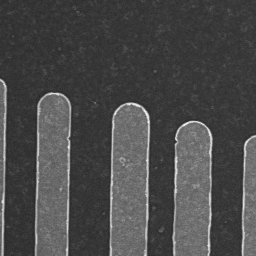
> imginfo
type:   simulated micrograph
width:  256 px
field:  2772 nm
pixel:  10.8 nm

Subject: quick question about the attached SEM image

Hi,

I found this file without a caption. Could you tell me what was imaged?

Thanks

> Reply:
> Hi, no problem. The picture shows one or a few lines or trenches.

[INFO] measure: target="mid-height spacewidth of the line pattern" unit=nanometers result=352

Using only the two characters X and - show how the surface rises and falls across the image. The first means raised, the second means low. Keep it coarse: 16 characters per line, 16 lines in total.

----------------
----------------
----------------
----------------
----------------
----------------
--XX------------
--XX---XX-------
--XX---XX--XX---
--XX---XX--XX--X
--XX---XX--XX--X
--XX---XX--XX--X
--XX---XX--XX--X
--XX---XX--XX--X
--XX---XX--XX--X
--XX---XX--XX--X